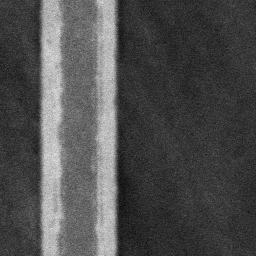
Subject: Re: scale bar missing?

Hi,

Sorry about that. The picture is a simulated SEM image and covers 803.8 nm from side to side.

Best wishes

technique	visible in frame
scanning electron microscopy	one or a few lines or trenches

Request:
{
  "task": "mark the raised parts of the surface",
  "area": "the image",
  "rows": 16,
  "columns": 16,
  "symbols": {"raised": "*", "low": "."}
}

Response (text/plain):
...****.........
...****.........
...****.........
...****.........
...****.........
...****.........
...****.........
...****.........
...****.........
...****.........
...****.........
...****.........
...****.........
...****.........
...****.........
...****.........